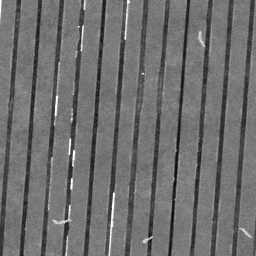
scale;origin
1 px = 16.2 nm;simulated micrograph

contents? parallel lines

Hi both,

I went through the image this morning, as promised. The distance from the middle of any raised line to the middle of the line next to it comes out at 343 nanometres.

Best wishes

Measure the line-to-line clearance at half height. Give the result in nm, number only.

80.7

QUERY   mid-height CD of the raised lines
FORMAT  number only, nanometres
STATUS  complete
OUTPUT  273